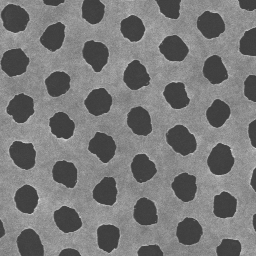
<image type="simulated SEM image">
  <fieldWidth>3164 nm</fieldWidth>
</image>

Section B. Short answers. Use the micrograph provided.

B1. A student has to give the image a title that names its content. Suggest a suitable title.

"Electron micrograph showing a regular array of holes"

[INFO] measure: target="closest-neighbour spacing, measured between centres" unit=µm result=0.543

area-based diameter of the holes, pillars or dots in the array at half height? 327 nm